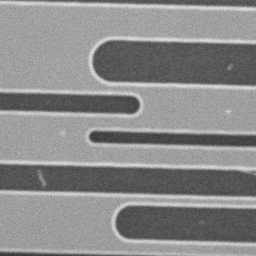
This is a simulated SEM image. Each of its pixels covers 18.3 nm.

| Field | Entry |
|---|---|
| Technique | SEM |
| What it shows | groups of lines, slits or small figures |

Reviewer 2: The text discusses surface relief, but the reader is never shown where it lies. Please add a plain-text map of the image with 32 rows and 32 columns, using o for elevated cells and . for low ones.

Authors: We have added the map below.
ooooooo.........................
oooooooooooooooooooooooooooooooo
oooooooooooooooooooooooooooooooo
oooooooooooooooooooooooooooooooo
oooooooooooooooooooooooooooooooo
oooooooooooo....................
oooooooooooo....................
ooooooooooo.....................
oooooooooooo....................
oooooooooooo....................
ooooooooooooooooo...............
.....ooooooooooooooooooooooooooo
.................ooooooooooooooo
..................oooooooooooooo
oooooooooooooooooooooooooooooooo
oooooooooooooooooooooooooooooooo
ooooooooooo............ooooooooo
ooooooooooo.....................
oooooooooooooooooooooooooooooo..
oooooooooooooooooooooooooooooooo
.........ooooooooooooooooooooooo
................................
................................
................................
ooooooooooooooooooo.............
oooooooooooooooo...ooooooooooooo
ooooooooooooooo.................
oooooooooooooo..................
oooooooooooooo..................
ooooooooooooooo.................
ooooooooooooooooooooooooooooo...
.......ooooooooooooooooooooooooo